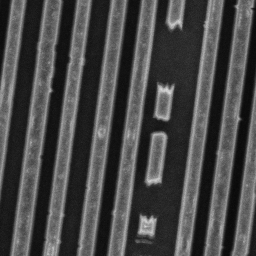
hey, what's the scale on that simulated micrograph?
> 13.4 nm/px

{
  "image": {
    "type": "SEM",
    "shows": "parallel lines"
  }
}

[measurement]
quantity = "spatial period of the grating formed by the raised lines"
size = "426 nanometres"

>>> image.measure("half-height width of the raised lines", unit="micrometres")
0.204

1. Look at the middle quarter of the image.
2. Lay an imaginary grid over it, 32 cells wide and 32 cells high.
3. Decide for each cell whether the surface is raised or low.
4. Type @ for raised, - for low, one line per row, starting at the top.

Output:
-@@@@-----@@@@---@@@@-----------
-@@@------@@@----@@@@-----------
-@@@-----@@@@----@@@@-----------
-@@@-----@@@@----@@@@-----------
-@@@-----@@@@----@@@------------
@@@@-----@@@@----@@@------------
@@@@-----@@@@---@@@@----@@------
@@@@-----@@@@---@@@@----@@@-----
@@@------@@@----@@@@---@@@@-----
@@@------@@@----@@@@---@@@@-----
@@@-----@@@@----@@@@---@@@@-----
@@@-----@@@@----@@@----@@@------
@@@-----@@@@----@@@----@@@------
@@@-----@@@@----@@@-----@@------
@@@-----@@@@---@@@@-------------
@@@-----@@@----@@@@-------------
@@------@@@@---@@@@-------------
@@------@@@----@@@@---@@@-------
@@-----@@@@----@@@@---@@@@------
@@-----@@@@----@@@----@@@-------
@@-----@@@@----@@@----@@@-------
@@-----@@@@---@@@@----@@@-------
@@-----@@@@---@@@@----@@@------@
@------@@@----@@@@---@@@@------@
@------@@@----@@@@---@@@@------@
@-----@@@@----@@@@---@@@@------@
@-----@@@@----@@@----@@@-------@
@-----@@@@----@@@----@@@-------@
@-----@@@@----@@@----@@@-------@
@-----@@@@---@@@@----@--------@@
@-----@@@----@@@@-------------@@
------@@@----@@@@-------------@@